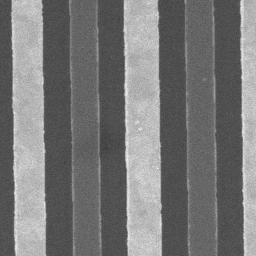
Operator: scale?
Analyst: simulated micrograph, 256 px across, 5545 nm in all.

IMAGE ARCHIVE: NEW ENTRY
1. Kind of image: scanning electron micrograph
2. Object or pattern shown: lines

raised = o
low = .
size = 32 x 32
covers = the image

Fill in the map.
..ooo....ooo....oooo...oooo...oo
..ooo....ooo....oooo...oooo...oo
..ooo....ooo....oooo...oooo...oo
..ooo....ooo....oooo...oooo...oo
..ooo....ooo....oooo...oooo...oo
..ooo....ooo....oooo...oooo...oo
..ooo....ooo....oooo...oooo...oo
..ooo....ooo....oooo...oooo...oo
..ooo....ooo....oooo...oooo...oo
..ooo....ooo....oooo...oooo...oo
..ooo....ooo....oooo...oooo...oo
..ooo....ooo....oooo...oooo...oo
..ooo....ooo....oooo...oooo...oo
..ooo....ooo....oooo...oooo...oo
..ooo....ooo....oooo...oooo...oo
..ooo....ooo....oooo...oooo...oo
..ooo....ooo....oooo...oooo...oo
..ooo....ooo....oooo...oooo...oo
..ooo....ooo....oooo...oooo...oo
..ooo....ooo....oooo...oooo...oo
..ooo....ooo....oooo...oooo...oo
..ooo....ooo....oooo...oooo...oo
..ooo....ooo....oooo...oooo....o
..ooo....ooo....oooo...oooo....o
..ooo....ooo....oooo....ooo....o
..oooo...ooo....oooo....ooo....o
..oooo...oooo...oooo....ooo....o
..oooo...oooo...oooo....ooo....o
..oooo...oooo...oooo....ooo....o
..oooo...oooo...oooo....ooo....o
..oooo...oooo...oooo....ooo....o
..oooo...oooo...oooo....ooo....o